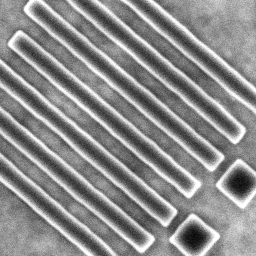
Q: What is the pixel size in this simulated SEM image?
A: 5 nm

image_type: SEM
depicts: groups of lines, slits or small figures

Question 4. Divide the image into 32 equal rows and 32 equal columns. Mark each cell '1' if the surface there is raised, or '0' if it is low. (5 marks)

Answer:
00001100011110001111000000000000
00011110001111000111100000000000
00001111000111100011110000000000
00000011100011110001111000000000
00100001110001111000111100000000
01111000111000011100001110000000
00111100011110001111000111100000
00011110001111000111100011110000
10001111000111100011110001111000
11000011100001110001111000111100
11100001110000111000011100011110
01111000111100011110001110000111
00111100011110001111000111100011
00011110001111000111100011110001
10000111000011100011110001111000
11000011100001110001111000111100
11110001110000111000011100001110
01111000111100011110001111000100
00111100011110001111000111100000
00011110001111000111100011110000
10000111000011100001110001100110
11100011110001110000111000001111
11110001111000111100011100001111
01111000111100011110001110011111
00111100011110001111000000001111
00001110001111000111100000000010
00000111000011100011110000000000
00000011110001111000100110000000
00000001111000111100001111000000
00000000111100011110001111100000
00000000011110001110001111100000
00000000000111000000000111000000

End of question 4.